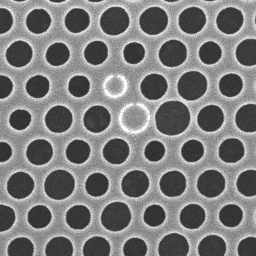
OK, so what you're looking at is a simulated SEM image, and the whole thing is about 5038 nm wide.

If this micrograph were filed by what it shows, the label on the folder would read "a regular array of holes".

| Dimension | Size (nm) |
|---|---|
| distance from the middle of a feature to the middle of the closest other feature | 736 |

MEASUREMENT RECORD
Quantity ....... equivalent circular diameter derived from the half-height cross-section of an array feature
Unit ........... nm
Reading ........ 515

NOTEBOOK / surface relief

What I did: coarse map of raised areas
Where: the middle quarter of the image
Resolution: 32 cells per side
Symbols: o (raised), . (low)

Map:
ooooooooooooooooooooooooo....ooo
oooooooooooooooooooooooooooooooo
ooooooooooooooooooooo...oooooo..
oo....oooooooooooooo.....oooo...
o.....ooooooooooooo.......oo....
o......oooooooooooo.......oo....
o.....ooooooooooooo.......oo....
oo....ooooooooooooo......oooo...
ooo.oooooooooooooooo....oooooo..
oooooooooooooooooooooooooo...ooo
oooooooo.ooooooooooooooo.......o
.ooooo.....oooooooooooo........o
..ooo......oooooooooooo.........
..ooo.......ooooooooooo.........
..ooo.......ooooooooooo.........
..ooo......oooooooooooo........o
.ooooo....oooooooooooooo......oo
ooooooooooooooooooooooooo....ooo
oooooooooooooooooooooooooooooooo
oo....ooooo.....ooooo...ooooooo.
o.....oooo......ooooo....ooooo..
.......ooo.......ooo.....oooo...
......oooo......oooo.....oooo...
o.....oooo......oooo.....ooooo..
oo...oooooo....oooooooooooooooo.
oooooooooooooooooooooooooooooooo
ooooooooooooooooooooooooooo.oooo
..ooooo...ooooo......oooo.....oo
...ooo.....oooo......ooo......oo
...oo......ooo.......ooo.......o
...oo......ooo.......ooo.......o
..oooo.....ooo.......ooo......oo